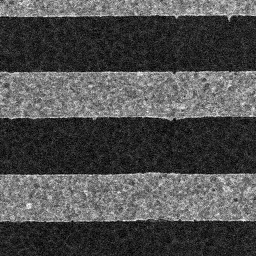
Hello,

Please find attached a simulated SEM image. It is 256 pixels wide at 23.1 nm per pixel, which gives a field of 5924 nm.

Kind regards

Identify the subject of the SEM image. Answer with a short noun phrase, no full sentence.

one or a few lines or trenches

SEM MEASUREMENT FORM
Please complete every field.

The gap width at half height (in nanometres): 1320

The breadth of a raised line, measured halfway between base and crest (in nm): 1050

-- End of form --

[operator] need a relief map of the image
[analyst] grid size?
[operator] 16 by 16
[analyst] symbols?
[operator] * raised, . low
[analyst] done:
****************
................
................
................
............**.*
****************
****************
................
................
................
................
****************
****************
****************
................
................